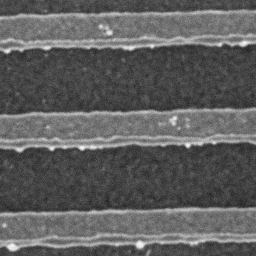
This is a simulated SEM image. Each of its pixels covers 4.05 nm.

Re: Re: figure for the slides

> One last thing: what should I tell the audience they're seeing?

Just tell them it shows lines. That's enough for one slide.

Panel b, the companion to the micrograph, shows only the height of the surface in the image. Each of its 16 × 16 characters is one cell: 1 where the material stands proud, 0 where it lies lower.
0000000000000000
1111111111111111
1111111111111111
0000000000000000
0000000000000000
0000000000000000
0000000000000000
1111111111111111
1111111111111111
0000000000000000
0000000000000000
0000000000000000
0000000000000000
1111111111111111
1111111111111111
1000000000000000